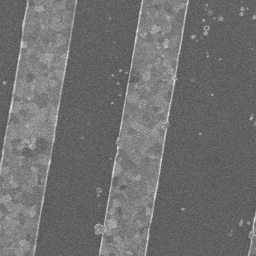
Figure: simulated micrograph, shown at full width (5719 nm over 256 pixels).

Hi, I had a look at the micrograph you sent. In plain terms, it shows one or a few lines or trenches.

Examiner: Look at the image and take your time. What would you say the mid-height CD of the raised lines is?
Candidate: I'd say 1000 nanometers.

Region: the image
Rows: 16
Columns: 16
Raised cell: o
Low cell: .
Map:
..ooo....ooo....
..ooo....ooo....
.ooo....ooo.....
.ooo....ooo.....
.ooo....ooo.....
.ooo....ooo.....
.ooo....ooo.....
.ooo....ooo.....
ooo....ooo......
ooo....ooo......
ooo....ooo......
ooo....ooo......
ooo....ooo......
ooo....oo.......
oo....ooo.......
oo....ooo.......